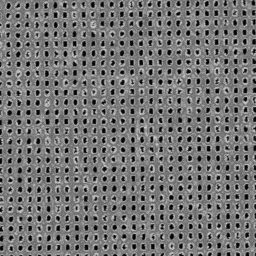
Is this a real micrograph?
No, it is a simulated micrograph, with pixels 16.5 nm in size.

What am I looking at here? a regular array of holes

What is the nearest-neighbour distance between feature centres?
0.15 um